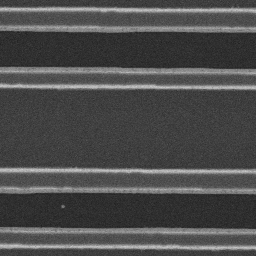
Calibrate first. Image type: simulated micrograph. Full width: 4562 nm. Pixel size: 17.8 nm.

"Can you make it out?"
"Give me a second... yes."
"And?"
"lines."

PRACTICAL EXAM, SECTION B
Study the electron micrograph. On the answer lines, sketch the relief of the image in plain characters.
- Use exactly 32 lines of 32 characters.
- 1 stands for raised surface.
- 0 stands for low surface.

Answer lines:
00000000000000000000000000000000
11111111111111111111111111111111
11111111111111111111111111111111
00001111111111111111111111111111
00000000000000000000000000000000
00000000000000000000000000000000
00000000000000000000000000000000
00000000000000000000000000000000
00000000000000000000000000000000
11111111111111111111111111111111
11111111111111111111111111111111
00000000000000000000000000000000
00000000000000000000000000000000
00000000000000000000000000000000
00000000000000000000000000000000
00000000000000000000000000000000
00000000000000000000000000000000
00000000000000000000000000000000
00000000000000000000000000000000
00000000000000000000000000000000
00000000000000000000000000000000
11111111111111111111111000000000
11111111111111111111111111111111
11111111111111111111111111111111
00000000000000000000000000000000
00000000000000000000000000000000
00000000000000000000000000000000
00000000000000000000000000000000
00000000000000000000000000000000
11111111111111111111111111111111
11111111111111111111111111111111
00000000000000000000000000000000